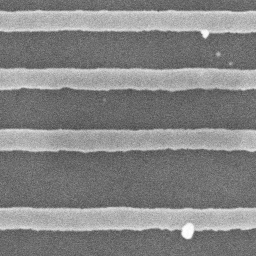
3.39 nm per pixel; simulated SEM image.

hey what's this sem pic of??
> lines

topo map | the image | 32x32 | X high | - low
--------------------------------
X-XXXXXXXXXXXXXXXXXXXXXXXXXXX-XX
XXXXXXXXXXXXXXXXXXXXXXXXXXXXXXXX
XXXXXXXXXXXXXXXXXXXXXXXXXXXXXXXX
--------------------------------
--------------------------------
--------------------------------
--------------------------------
--------------------------------
XXXXXXXXXXXXXXXXXXXXXXXXXXXXXXXX
XXXXXXXXXXXXXXXXXXXXXXXXXXXXXXXX
--------------------------------
--------------------------------
--------------------------------
--------------------------------
--------------------------------
XXXXXXXXXXXXXXXXXXXXXXXXXXXXXXXX
XXXXXXXXXXXXXXXXXXXXXXXXXXXXXXXX
XXXXXXXXXXXXXXXXXXXXXXXXXXXXXXXX
--------------------------------
--------------------------------
--------------------------------
--------------------------------
--------------------------------
--------------------------------
--------------------------------
XXXXXXXXXXXXXXXXXXXXXXXXXXXXXXXX
XXXXXXXXXXXXXXXXXXXXXXXXXXXXXXXX
XXXXXXXXXXXXXXXXXXX-XXXXXXXXXXXX
-----------------------X--------
--------------------------------
--------------------------------